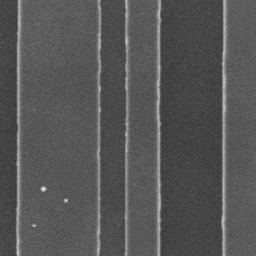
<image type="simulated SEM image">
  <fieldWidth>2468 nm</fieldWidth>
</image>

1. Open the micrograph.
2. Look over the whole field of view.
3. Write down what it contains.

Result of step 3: lines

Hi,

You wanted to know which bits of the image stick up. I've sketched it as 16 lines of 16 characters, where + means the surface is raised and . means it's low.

.+++++++++....++
.+++++++++....++
.+++++++++....++
.+++++++++....++
.+++++++++....++
.+++++++++....++
.+++++++++....++
.+++++++++....++
.+++++++++....++
.+++++++++....++
.+++++++++....++
.+++++++++....++
.+++++++++....++
.+++++++++....++
.+++++++++....++
.+++++++++....++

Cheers